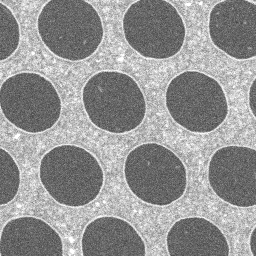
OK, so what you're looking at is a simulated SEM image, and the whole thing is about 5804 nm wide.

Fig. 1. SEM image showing holes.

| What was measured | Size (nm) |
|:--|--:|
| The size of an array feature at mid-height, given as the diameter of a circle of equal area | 1410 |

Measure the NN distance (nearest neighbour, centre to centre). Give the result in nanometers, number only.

1880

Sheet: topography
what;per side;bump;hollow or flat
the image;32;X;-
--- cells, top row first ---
XXXXXX-----XXXXXX----XXXXXX-----
-XXXX-------XXXX------XXXX------
--XXX--------XX--------XXX------
--XXX--------XX--------XXX------
--XXX--------XXX-------XXX------
--XXXX------XXXX-------XXXX-----
--XXXXX-----XXXXX-----XXXXXX----
XXXXXXXXX-XXXXXXXXXXXXXXXXXXXXXX
XXXXXXXXXXXXXXXXXXXXXXXXXXXXXXXX
XX---XXXXXXX----XXXXXX----XXXXXX
------XXXXX------XXXX------XXXX-
-------XXX--------XXX-------XXX-
--------XX--------XXX-------XXX-
--------XXX-------XXX-------XXX-
X------XXXX-------XXX-------XXXX
XX-----XXXXX------XXXX------XXXX
XXX--XXXXXXXXX--XXXXXXXX--XXXXXX
XXXXXXXXXXXXXXXXXXXXXXXXXXXXXXXX
XXXXXXX---XXXXXXX----XXXXXXX---X
-XXXXX------XXXX------XXXXX-----
--XXX-------XXXX-------XXX------
--XXX--------XXX-------XXX------
---XX--------XXX-------XXX------
--XXXX-------XXX-------XXX------
--XXXX------XXXXX------XXXX-----
-XXXXXXX---XXXXXXXX--XXXXXXXX---
XXXXXXXXXXXXXXXXXXXXXXXXXXXXXXXX
X----XXXXXXX---XXXXXXX----XXXXXX
-------XXXX------XXXX------XXXXX
-------XXX-------XXXX-------XXX-
--------XX--------XXX--------XX-
--------XX--------XXX--------XX-